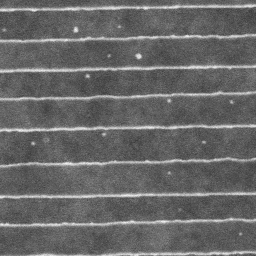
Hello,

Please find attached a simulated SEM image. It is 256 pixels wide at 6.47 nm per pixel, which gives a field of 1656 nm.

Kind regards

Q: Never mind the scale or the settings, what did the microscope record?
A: lines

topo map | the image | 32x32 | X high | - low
XXXXXXXXXXXXXXXXXXXXXXXXXXXXXXXX
--------------------------------
--------------------------------
--------------------------------
------------------------------XX
XXXXXXXXXXXXXXXXXXXXXXXXXXXXXXXX
XXXXXXXXXXXXXXXXXXXXXXXXXXXXXXXX
XXXXXXXXXXXXXXXXXXXXXXXXXXXXXXXX
XXXXXXXXXXXXXXXXXXXX------------
--------------------------------
--------------------------------
--------------------------------
XXXXXXXXXXXXXXXXXXXXXXXXXXXXXXXX
XXXXXXXXXXXXXXXXXXXXXXXXXXXXXXXX
XXXXXXXXXXXXXXXXXXXXXXXXXXXXXXXX
XXXXXXXXXXXXXXXXXXXXXXXXXXXXXXXX
--------------------------------
--------------------------------
--------------------------------
--------------------------------
---XX---XXXXXXXXXXXXXXXXXXXXXXXX
XXXXXXXXXXXXXXXXXXXXXXXXXXXXXXXX
XXXXXXXXXXXXXXXXXXXXXXXXXXXXXXXX
XXXXXXXXXXXXXXXXXXXXXXXXXXXXXXXX
XXXXXXXXXXXX--------------------
--------------------------------
--------------------------------
----------------------------XXXX
XXXXXXXXXXXXXXXXXXXXXXXXXXXXXXXX
XXXXXXXXXXXXXXXXXXXXXXXXXXXXXXXX
XXXXXXXXXXXXXXXXXXXXXXXXXXXXXXXX
XXXXXXXXXXXXXXXXXXXXXXXXXXXXXXXX